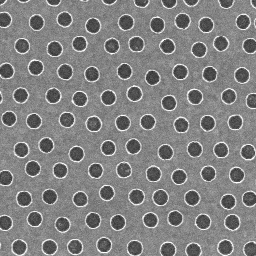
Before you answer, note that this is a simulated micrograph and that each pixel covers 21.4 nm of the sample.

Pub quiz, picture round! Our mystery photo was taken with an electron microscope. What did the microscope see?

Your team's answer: a regular array of holes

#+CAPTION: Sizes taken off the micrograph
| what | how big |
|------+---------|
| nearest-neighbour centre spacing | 537 nm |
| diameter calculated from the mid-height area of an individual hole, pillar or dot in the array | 0.314 microns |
